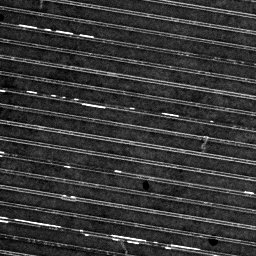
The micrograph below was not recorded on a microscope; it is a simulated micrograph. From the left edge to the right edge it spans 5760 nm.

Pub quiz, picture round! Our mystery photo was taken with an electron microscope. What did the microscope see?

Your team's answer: parallel lines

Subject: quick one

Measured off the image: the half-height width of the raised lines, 63.8 nm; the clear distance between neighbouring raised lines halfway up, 303 nm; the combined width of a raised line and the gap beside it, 361 nm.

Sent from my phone